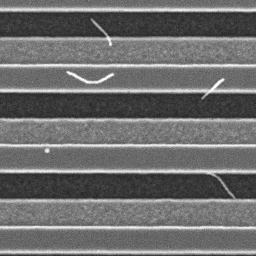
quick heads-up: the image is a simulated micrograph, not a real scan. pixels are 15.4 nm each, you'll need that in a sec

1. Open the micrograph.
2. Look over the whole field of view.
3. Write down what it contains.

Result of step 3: lines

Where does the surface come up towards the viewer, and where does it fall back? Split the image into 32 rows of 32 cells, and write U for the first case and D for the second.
UUUUUUUUUUUUUUUUUUUUUUUUUUUUUUUU
DDDDDDDDDDDDDDDDDDDDDDDDDDDDDDDD
DDDDDDDDDDDDDDDDDDDDDDDDDDDDDDDD
DDDDDDDDDDDDDDDDDDDDDDDDDDDDDDDD
DDDDDDDDDDDDDDDDDDDDDDDDDDDDDDDD
UUUUUUUUUUUUUUUUUUUUUUUUUUUUUUUU
UUUUUUUUUUUUUUUUUUUUUUUUUUUUUUUU
UUUUUUUUUUUUUUUUUUUUUUUUUUUUUUUU
UUUUUUUUUUUUUUUUUUUUUUUUUUUUUUUU
UUUUUUUUUUUUUUUUUUUUUUUUUUUUUUUU
UUUUUUUUUUUUUUUUUUUUUUUUUUUUUUUU
DDDDDDDDDDDDDDDDDDDDDDDDDUUDDDDD
DDDDDDDDDDDDDDDDDDDDDDDDDDDDDDDD
DDDDDDDDDDDDDDDDDDDDDDDDDDDDDDDD
DDDDDDDDDDDDDDDDDDDDDDDDDDDDDDDD
UUUUUUUUUUUUUUUUUUUUUUUUUUUUUUUU
UUUUUUUUUUUUUUUUUUUUUUUUUUUUUUUU
UUUUUUUUUUUUUUUUUUUUUUUUUUUUUUUU
UUUUUUUUUUUUUUUUUUUUUUUUUUUUUUUU
UUUUUUUUUUUUUUUUUUUUUUUUUUUUUUUU
UUUUUUUUUUUUUUUUUUUUUUUUUUUUUUUU
DDDDDDDDDDDDDDDDDDDDDDDDDDDDDDDD
DDDDDDDDDDDDDDDDDDDDDDDDDDDDDDDD
DDDDDDDDDDDDDDDDDDDDDDDDDDDDDDDD
DDDDDDDDDDDDDDDDDDDDDDDDDDDDDDDD
UUUUUUUUUUUUUUUUUUUUUUUUUUUUUUUU
UUUUUUUUUUUUUUUUUUUUUUUUUUUUUUUU
UUUUUUUUUUUUUUUUUUUUUUUUUUUUUUUU
UUUUUUUUUUUUUUUUUUUUUUUUUUUUUUUU
UUUUUUUUUUUUUUUUUUUUUUUUUUUUUUUU
UUUUUUUUUUUUUUUUUUUUUUUUUUUUUUUU
UUUUUUUUUUUUUUUUUUUUUUUUUUUUUUUU